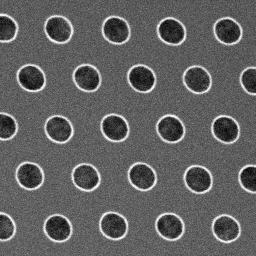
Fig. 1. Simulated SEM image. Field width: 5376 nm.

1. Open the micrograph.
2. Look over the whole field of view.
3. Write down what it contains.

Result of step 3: a regular array of holes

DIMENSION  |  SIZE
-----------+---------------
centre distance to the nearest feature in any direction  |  1160 nm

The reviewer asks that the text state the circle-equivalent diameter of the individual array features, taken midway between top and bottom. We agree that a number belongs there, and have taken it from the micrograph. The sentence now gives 541 nm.